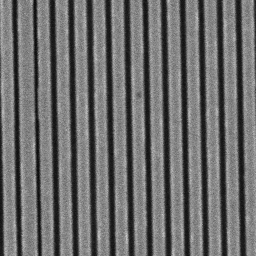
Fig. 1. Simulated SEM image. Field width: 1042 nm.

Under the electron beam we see parallel lines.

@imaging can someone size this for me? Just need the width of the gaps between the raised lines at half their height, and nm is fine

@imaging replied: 24.4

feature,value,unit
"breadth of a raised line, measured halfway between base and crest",0.0524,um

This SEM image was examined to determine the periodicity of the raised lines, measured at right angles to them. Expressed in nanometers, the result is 75.6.